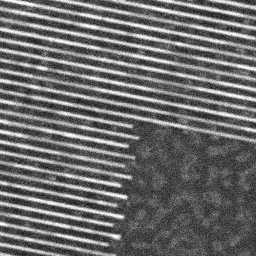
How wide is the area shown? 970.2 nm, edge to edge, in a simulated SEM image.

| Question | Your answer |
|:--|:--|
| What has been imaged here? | parallel lines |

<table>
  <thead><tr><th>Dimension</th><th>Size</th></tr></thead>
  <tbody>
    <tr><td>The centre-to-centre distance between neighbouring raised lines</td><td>38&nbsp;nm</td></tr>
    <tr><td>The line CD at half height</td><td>7.9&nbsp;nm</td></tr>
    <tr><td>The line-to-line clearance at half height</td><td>28.8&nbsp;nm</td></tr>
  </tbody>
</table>